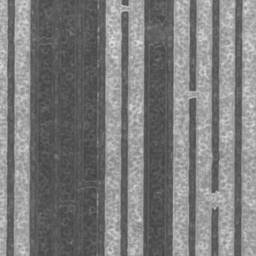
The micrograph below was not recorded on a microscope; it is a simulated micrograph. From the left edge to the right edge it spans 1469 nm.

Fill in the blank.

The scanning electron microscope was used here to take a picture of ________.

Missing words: parallel lines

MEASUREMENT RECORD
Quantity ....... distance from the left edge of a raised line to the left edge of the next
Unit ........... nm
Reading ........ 130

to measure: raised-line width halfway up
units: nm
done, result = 87.6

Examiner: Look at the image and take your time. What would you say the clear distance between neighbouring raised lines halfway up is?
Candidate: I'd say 43.8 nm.